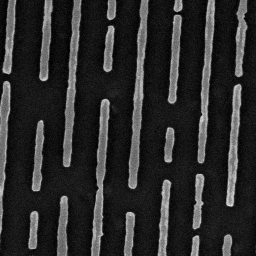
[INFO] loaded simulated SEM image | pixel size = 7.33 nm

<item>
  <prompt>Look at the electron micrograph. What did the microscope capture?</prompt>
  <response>parallel lines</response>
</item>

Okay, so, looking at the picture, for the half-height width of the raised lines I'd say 55.7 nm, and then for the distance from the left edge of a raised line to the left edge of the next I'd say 32.7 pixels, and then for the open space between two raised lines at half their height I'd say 188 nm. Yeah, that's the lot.